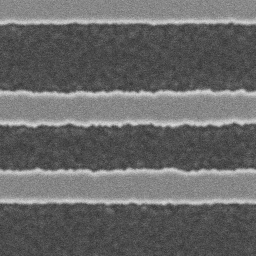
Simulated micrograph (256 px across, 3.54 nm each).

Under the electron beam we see lines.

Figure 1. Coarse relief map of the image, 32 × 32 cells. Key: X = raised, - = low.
XXXXXXXXXXXXXXXXXXXXXXXXXXXXXXXX
XXXXXXXXXXXXXXXXXXXXXXXXXXXXXXXX
XXXXXXXXXXXXXXXXXXXXXXXXXXXXXXXX
--------------------------------
--------------------------------
--------------------------------
--------------------------------
--------------------------------
--------------------------------
--------------------------------
--------------------------------
XXXX------X---XX----XX-XXXXXXXX-
XXXXXXXXXXXXXXXXXXXXXXXXXXXXXXXX
XXXXXXXXXXXXXXXXXXXXXXXXXXXXXXXX
XXXXXXXXXXXXXXXXXXXXXXXXXXXXXXXX
XXXXXXXX-XXXXXXXXX-XXXX-XXXX----
--------------------------------
--------------------------------
--------------------------------
--------------------------------
--------------------------------
XXXXXXXXXXXXXXXXXXXXXXXXXXXXXXXX
XXXXXXXXXXXXXXXXXXXXXXXXXXXXXXXX
XXXXXXXXXXXXXXXXXXXXXXXXXXXXXXXX
XXXXXXXXXXXXXXXXXXXXXXXXXXXXXXXX
-------------X-X-X-XXXXXX-------
--------------------------------
--------------------------------
--------------------------------
--------------------------------
--------------------------------
--------------------------------